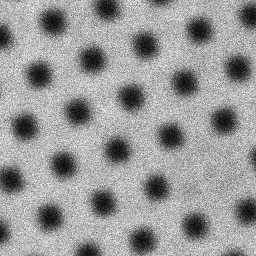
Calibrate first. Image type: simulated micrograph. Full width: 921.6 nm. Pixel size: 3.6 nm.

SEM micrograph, a regular array of holes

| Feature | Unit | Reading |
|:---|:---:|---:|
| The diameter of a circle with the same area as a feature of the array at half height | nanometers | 102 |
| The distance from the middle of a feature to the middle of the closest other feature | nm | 196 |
